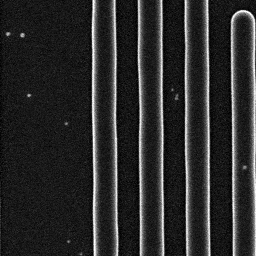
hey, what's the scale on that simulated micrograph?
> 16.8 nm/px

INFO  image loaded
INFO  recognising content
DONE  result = groups of lines, slits or small figures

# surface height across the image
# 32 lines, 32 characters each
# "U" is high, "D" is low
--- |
DDDDDDDDDDDDUUDDDUUUDDDUUUDDDDDD
DDDDDDDDDDDDUUDDDUUUDDDUUUDDDDUD
DDDDDDDDDDDDUUDDDUUUDDDUUUDDDUUU
DDDDDDDDDDDDUUDDDUUUDDDUUUDDDUUU
DDDDDDDDDDDDUUDDDUUUDDDUUUDDDUUU
DDDDDDDDDDDDUUDDDUUUDDDUUUDDDUUU
DDDDDDDDDDDDUUDDDUUUDDDUUUDDDUUU
DDDDDDDDDDDDUUDDDUUUDDDUUUDDDUUU
DDDDDDDDDDDDUUDDDUUUDDDUUUDDDUUU
DDDDDDDDDDDDUUDDDUUUDDDUUUDDDUUU
DDDDDDDDDDDDUUDDDUUUDDDUUUDDDUUU
DDDDDDDDDDDDUUDDDDUUDDDUUUDDDUUU
DDDDDDDDDDDDUUDDDDUUDDDUUUDDDUUU
DDDDDDDDDDDDUUDDDDUUDDDUUUDDDUUU
DDDDDDDDDDDDUUDDDDUUDDDUUUDDDUUU
DDDDDDDDDDDDUUDDDDUUDDDUUUDDDUUU
DDDDDDDDDDDDUUDDDDUUDDDUUUDDDUUU
DDDDDDDDDDDDUUDDDDUUDDDUUUDDDUUU
DDDDDDDDDDDDUUDDDDUUDDDUUUDDDUUU
DDDDDDDDDDDDUUDDDDUUDDDUUUDDDUUU
DDDDDDDDDDDDUUDDDDUUDDDUUUDDDUUU
DDDDDDDDDDDDUUDDDDUUDDDUUUDDDUUU
DDDDDDDDDDDDUUUDDDUUDDDUUUDDDUUU
DDDDDDDDDDDDUUUDDDUUDDDUUUDDDUUU
DDDDDDDDDDDDUUUDDDUUDDDUUUDDDUUU
DDDDDDDDDDDDUUUDDDUUDDDUUUDDDUUU
DDDDDDDDDDDDUUUDDDUUDDDUUUDDDUUU
DDDDDDDDDDDDUUUDDDUUDDDUUUDDDUUU
DDDDDDDDDDDDUUUDDDUUDDDUUUDDDUUU
DDDDDDDDDDDDUUUDDDUUDDDUUUDDDUUU
DDDDDDDDDDDDUUUDDDUUDDDUUUDDDUUU
DDDDDDDDDDDDUUUDDDUUDDDUUUDDDUUU